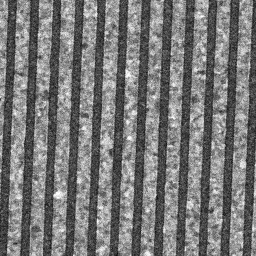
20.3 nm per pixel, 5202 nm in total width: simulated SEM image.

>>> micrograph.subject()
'parallel lines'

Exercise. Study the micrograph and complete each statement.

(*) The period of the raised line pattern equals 22.2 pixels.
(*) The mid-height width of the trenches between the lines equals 0.19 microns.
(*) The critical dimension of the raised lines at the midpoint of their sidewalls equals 0.261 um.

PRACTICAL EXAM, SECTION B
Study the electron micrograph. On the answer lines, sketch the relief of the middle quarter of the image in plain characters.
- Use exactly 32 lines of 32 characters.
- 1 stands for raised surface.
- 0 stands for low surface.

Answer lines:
11001110001110001110011100011100
11001110001110001110011100011100
11001110001110001100011100011000
11001110001110011100011100011000
11001110001110011100011100011000
11001110001110011100011100011000
11001110001110011100011100111000
11001110001110011100011100011000
11001110001110011100011100011000
11001110001110011100011100111000
11001110001110011100011100111000
10001110001110011100011100111000
10001110001110011100011100111000
10001110001110011100011100111000
10001110011100011100011100111000
10001110011100011100011100111000
10001110011100011100011000111000
10001110011100011100011000111000
10001110011100011100011000111000
10001110011100011100011000111000
10001110011100011100111000111001
10001110011100011100111000111001
10001110011100011100111000111001
10001110011100011100111000111001
10001110011100011100111000111001
10011100011100011100111000111001
10011100011100011100111000111001
10011100011100011000111000111001
10011100011100111000111000111001
10011100011100111000111000111001
10011100011100111000111001110001
10011100011100111000111001110001